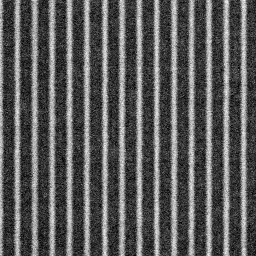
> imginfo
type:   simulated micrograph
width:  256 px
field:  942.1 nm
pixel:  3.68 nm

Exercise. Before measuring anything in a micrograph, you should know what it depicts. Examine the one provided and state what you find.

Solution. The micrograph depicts parallel lines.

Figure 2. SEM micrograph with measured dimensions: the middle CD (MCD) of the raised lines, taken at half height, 15.6 nanometers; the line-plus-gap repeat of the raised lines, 64.1 nm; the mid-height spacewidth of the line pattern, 50.1 nanometres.